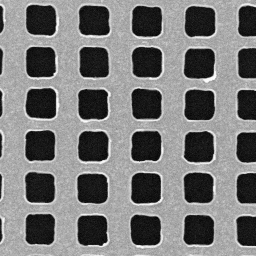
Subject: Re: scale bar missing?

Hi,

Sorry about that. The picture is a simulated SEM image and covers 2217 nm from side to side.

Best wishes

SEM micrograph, a regular array of holes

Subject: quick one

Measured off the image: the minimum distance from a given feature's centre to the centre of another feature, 360 nm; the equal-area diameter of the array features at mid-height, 33.3 pixels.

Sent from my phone